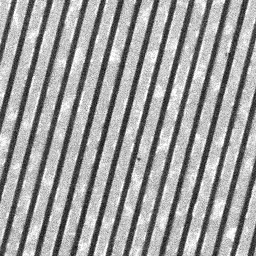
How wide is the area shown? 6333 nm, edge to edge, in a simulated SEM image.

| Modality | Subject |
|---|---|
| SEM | parallel lines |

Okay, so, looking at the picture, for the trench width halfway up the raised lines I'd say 0.153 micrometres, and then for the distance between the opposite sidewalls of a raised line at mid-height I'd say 10.6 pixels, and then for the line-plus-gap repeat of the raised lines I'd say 426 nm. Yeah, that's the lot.